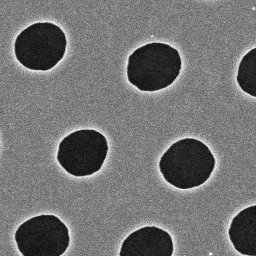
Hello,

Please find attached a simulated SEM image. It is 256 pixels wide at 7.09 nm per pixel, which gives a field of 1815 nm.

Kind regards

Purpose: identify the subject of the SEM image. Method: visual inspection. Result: holes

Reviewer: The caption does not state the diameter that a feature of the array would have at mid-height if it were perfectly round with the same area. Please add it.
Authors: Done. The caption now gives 362 nanometers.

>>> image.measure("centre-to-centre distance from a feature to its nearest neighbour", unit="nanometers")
736